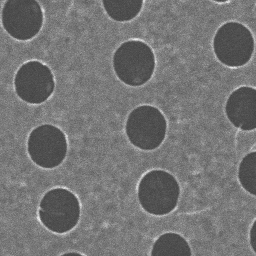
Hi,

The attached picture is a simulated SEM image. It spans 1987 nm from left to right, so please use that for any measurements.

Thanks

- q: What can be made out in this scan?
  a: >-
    holes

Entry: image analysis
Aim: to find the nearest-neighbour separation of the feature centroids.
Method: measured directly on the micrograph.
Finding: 510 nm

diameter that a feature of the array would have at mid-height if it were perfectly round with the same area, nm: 331